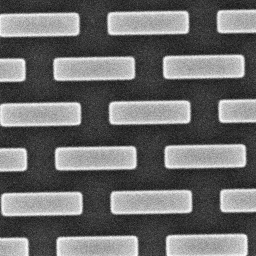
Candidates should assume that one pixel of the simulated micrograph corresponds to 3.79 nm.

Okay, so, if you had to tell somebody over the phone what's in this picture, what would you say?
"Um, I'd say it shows groups of lines, slits or small figures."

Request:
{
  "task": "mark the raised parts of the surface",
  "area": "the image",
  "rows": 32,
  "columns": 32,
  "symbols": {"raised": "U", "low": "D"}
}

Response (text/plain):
DDDDDDDDDDDDDDDDDDDDDDDDDDDDDDDD
DDDDDDDDDDDDDDDDDDDDDDDDDDDDUUUU
UUUUUUUUUUDDDDUUUUUUUUUDDDDUUUUU
UUUUUUUUUUDDDDUUUUUUUUUDDDDUUUUU
DDDDDDDDDDDDDDDDDDDDDDDDDDDDDDDD
DDDDDDDDDDDDDDDDDDDDDDDDDDDDDDDD
DDDDDDDDDDDDDDDDDDDDDDDDDDDDDDDD
UUUDDDDUUUUUUUUUUDDDDUUUUUUUUUDD
UUUDDDDUUUUUUUUUUDDDDUUUUUUUUUDD
UUUDDDDUUUUUUUUUUDDDDUUUUUUUUUDD
DDDDDDDDDDDDDDDDDDDDDDDDDDDDDDDD
DDDDDDDDDDDDDDDDDDDDDDDDDDDDDDDD
DDDDDDDDDDDDDDDDDDDDDDDDDDDDDDDD
UUUUUUUUUUDDDDUUUUUUUUUUDDDUUUUU
UUUUUUUUUUDDDDUUUUUUUUUUDDDUUUUU
UUUUUUUUUUDDDDDDDDDDDDDDDDDDDDDD
DDDDDDDDDDDDDDDDDDDDDDDDDDDDDDDD
DDDDDDDDDDDDDDDDDDDDDDDDDDDDDDDD
DDDDDDDDDDDUUUUUUDDDDUUUUUUUUUDD
UUUDDDDUUUUUUUUUUDDDDUUUUUUUUUUD
UUUDDDDUUUUUUUUUUDDDDUUUUUUUUUDD
DDDDDDDDDDDDDDDDDDDDDDDDDDDDDDDD
DDDDDDDDDDDDDDDDDDDDDDDDDDDDDDDD
DDDDDDDDDDDDDDDDDDDDDDDDDDDDDDDD
UUUUUUUUUUDDDDUUUUUUUUUUDDDDUUUU
UUUUUUUUUUDDDDUUUUUUUUUUDDDDUUUU
UUUUUUUUUUDDDDUUUUUUUUUDDDDDDDDD
DDDDDDDDDDDDDDDDDDDDDDDDDDDDDDDD
DDDDDDDDDDDDDDDDDDDDDDDDDDDDDDDD
DDDDDDDDDDDDDDDDDDDDDDDUUUUUUUDD
UUUDDDDUUUUUUUUUUDDDDUUUUUUUUUUD
UUUDDDDUUUUUUUUUUDDDDUUUUUUUUUUD